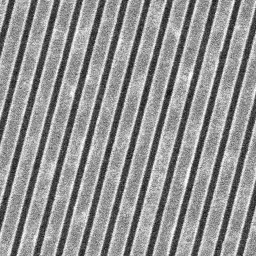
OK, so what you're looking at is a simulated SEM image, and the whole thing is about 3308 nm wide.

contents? parallel lines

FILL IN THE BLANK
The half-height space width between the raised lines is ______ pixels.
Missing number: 7.38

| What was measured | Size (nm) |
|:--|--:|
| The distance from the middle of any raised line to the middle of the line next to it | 282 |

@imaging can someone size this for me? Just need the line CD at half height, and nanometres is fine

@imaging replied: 191